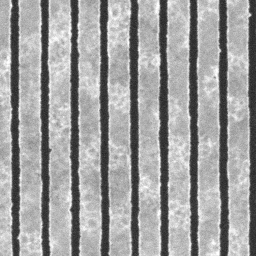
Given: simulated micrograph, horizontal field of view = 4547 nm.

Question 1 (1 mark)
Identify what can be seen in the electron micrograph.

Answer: parallel lines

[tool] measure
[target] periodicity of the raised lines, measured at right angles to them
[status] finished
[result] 528 nanometers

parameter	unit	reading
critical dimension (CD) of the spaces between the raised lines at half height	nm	155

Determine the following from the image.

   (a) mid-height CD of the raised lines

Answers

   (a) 373 nm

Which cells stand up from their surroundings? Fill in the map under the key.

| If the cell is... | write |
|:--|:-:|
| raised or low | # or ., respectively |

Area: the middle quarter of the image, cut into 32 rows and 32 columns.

#...#####..#####...#####..#####.
#...#####..#####...#####..#####.
#...#####..#####...#####..#####.
#...#.###..#####...#####..#####.
#...#####..#####...#####..#####.
#...#####..#####...#####..#####.
#...#####..#####...#####..#####.
#...#####..#####...#####..#####.
#...#####..#####...#####..#####.
#...#####..#####...#####..#####.
#...#####..#####...#####..#####.
##..#####..#####...#####..#####.
##..#####..#####...#####..#####.
##..#####..#####...#####..#####.
##..#####..#####...#####..#####.
##..#####..#####...#####..#####.
##..#####..#####...#####..#####.
##..#####..#####...#####..#####.
##..#####..#####...#####..#####.
#...#####..#####...#####..#####.
#...#####..#####...#####..#####.
#...#####..######..#####..#####.
#...#####...#####..#####..#####.
#...##.##..######..#####..#####.
##..#####..######..#####..#####.
##..#####..######..#####..#####.
##..#####..######..#####..#####.
##..#####..######..#####..#####.
##..#####..######..#####..#####.
##..#####..######..#####..#####.
##..#####..######..#####..#####.
##..#####..######..#####..#####.